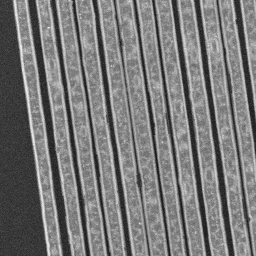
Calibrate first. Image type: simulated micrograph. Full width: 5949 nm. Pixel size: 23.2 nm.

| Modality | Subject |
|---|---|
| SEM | parallel lines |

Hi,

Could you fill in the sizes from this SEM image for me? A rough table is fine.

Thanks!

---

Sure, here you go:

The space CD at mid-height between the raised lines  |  178 nm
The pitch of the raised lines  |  0.476 µm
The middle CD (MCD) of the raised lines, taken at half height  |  291 nanometres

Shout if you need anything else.